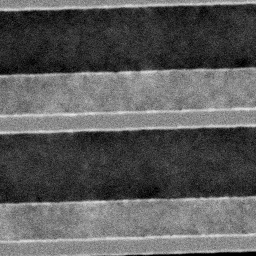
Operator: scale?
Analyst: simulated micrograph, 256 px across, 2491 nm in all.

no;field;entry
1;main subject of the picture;lines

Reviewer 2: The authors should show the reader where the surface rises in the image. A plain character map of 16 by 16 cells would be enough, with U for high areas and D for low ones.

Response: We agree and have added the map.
UUUUUDDDDDDDDDDD
DDDDDDDDDDDDDDDD
DDDDDDDDDDDDDDDD
DDDDDDDDDDDDDDDD
DDDDDDDDDUUUUUUU
UUUUUUUUUUUUUUUU
UUUUUUUUUUUUUUUU
UUUUUUUUUUUUUUUU
DDDDDDDDDDDDDDDD
DDDDDDDDDDDDDDDD
DDDDDDDDDDDDDDDD
DDDDDDDDDDDDDDDD
DDDDDDDDDUUUUUUU
UUUUUUUUUUUUUUUU
UUUUUUUUUUUUUUUU
UUUUUUUUUUUUUUUU